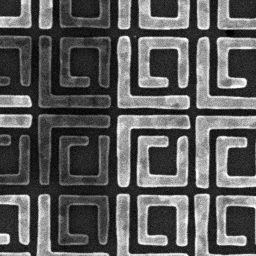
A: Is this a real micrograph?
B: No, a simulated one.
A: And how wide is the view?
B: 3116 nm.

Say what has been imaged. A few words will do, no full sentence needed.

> wiring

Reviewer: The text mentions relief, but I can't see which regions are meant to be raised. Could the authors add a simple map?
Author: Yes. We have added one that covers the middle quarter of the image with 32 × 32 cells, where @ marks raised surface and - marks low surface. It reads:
@--------@@---@@---@@--------@@-
@--------@@---@@---@@--------@@-
@@-------@@---@@---@@--------@@-
@@@@@@---@@---@@---@@@@@@----@@-
@@@@@@---@@---@@---@@@@@@@---@@-
@@@@@@---@@---@@---@@@@@@@---@--
--------------@@----------------
--------------@@@---------------
@@@@@@@@@@@@--@@@@@@@@@@@@@@@@@-
@@@@@@@@@@@@--@@@@@@@@@@@@@@@@@-
@@@@@@@@@@@@--@@@@@@@@@@@@@@@@@-
--------------------------------
--------------------------------
@@@@@@@@@@@---@@@@@@@@@@@@@@@@@-
@@@@@@@@@@@---@@@@@@@@@@@@@@@@@-
@@@@@@@@@@@--@@@@@@@@@@@@@@@@@@-
-------------@@@@---------------
-------------@@@----------------
@@@@@@---@@--@@@---@@@@@@@---@@-
@@@@@@---@@--@@@---@@@@@@@--@@@-
@@-------@@--@@@---@@@------@@@-
@--------@@--@@@---@@-------@@@-
@--------@@--@@@--@@@-------@@@-
@--------@@--@@@--@@@-------@@@-
@--------@@---@@--@@@-------@@@-
@--------@@---@@--@@@-------@@@-
@--------@@---@@--@@@-------@@@-
@@-------@@---@@--@@@-------@@@-
@@@@@@@@@@@---@@--@@@@@@@@@@@@@-
@@@@@@@@@@@---@@--@@@@@@@@@@@@@-
--------------@@---@@@@@--------
--------------------------------